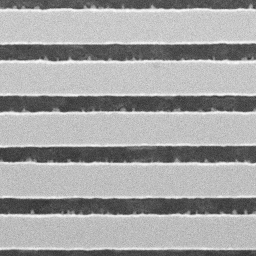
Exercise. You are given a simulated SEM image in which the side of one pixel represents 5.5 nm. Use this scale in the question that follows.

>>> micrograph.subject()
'lines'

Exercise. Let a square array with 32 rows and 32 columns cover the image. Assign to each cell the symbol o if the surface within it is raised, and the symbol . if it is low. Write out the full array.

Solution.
................................
oooooooooooooooooooooooooooooooo
oooooooooooooooooooooooooooooooo
oooooooooooooooooooooooooooooooo
oooooooooooooooooooooooooooooooo
o....o...............o..........
................................
................................
oooooooooooooooooooooooooooooooo
oooooooooooooooooooooooooooooooo
oooooooooooooooooooooooooooooooo
oooooooooooooooooooooooooooooooo
................................
................................
oooooooooooooooooooooooooooooooo
oooooooooooooooooooooooooooooooo
oooooooooooooooooooooooooooooooo
oooooooooooooooooooooooooooooooo
................................
................................
oooooooooooooooooooooooooooooooo
oooooooooooooooooooooooooooooooo
oooooooooooooooooooooooooooooooo
oooooooooooooooooooooooooooooooo
oooooooooooooooooooooooooooooooo
................................
................................
oooooooooooooooooooooooooooooooo
oooooooooooooooooooooooooooooooo
oooooooooooooooooooooooooooooooo
oooooooooooooooooooooooooooooooo
................................